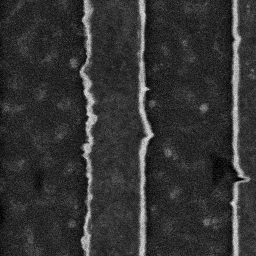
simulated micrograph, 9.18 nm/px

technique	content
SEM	one or a few lines or trenches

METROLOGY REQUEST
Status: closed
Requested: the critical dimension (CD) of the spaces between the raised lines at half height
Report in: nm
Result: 859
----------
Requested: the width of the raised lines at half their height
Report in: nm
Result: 504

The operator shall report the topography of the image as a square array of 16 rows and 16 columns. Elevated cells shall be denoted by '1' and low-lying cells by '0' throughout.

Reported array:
0000011110000001
0000011110000001
0000001110000001
0000011110000001
0000011110000001
0000011110000001
0000001110000001
0000001110000001
0000001110000001
0000011110000001
0000001110000001
0000001110000001
0000001110000001
0000011110000001
0000011110000001
0000011110000001